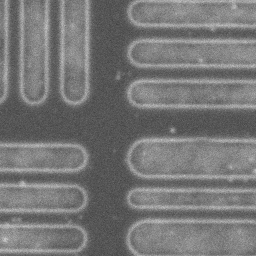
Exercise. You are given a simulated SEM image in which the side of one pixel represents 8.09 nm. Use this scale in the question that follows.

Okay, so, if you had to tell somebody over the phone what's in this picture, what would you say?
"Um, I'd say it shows groups of lines, slits or small figures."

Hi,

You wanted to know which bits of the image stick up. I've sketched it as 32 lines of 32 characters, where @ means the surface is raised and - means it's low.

-@@---@@---@@@@@@---------------
-@@---@@---@@@@@----------------
-@@---@@---@@@@@@---------------
-@@---@@---@@@@@@@@@@@@@@@@@@@@@
-@@---@@---@@@@@@@@@@@@@@@@@@@@@
-@@---@@---@@@@@@---------------
-@@---@@---@@@@@----------------
-@@---@@---@@@@@@---------------
-@@---@@---@@@@@@@@@@@@@@@@@@@@@
-@@---@@---@@@@@@@@@@@@@@@@@@@@@
-@@---@@---@@@@@@---------------
-@@---@@---@@@@@----------------
@@@--@@@@-@@@@@@----------------
@@@@@@@@@@@@@@@@@@@@@@@@@@@@@@@@
@@@@@@@@@@@@@@@@@@@@@@@@@@@@@@@@
@@@@@@@@@@@@@@@@@@@@@@@@@@@@@@@@
@@@@@@@@@@@@@@@@@@@@@@@@@@@@@@@@
@@@@@@@@@@@@@@@@@@@@@@@@@@@@@@@@
----------@@@@@@@---------------
-----------@@@@@----------------
----------@@@@@@----------------
@@@@@@@@@@@@@@@@@---------------
@@@@@@@@@@@@@@@@@@@@@@@@@@@@@@@@
----------@@@@@@@@@@@@@@@@@@@@@@
-----------@@@@@----------------
----------@@@@@@@---------------
@@@@@@@@@@@@@@@@@@@@@@@@@@@@@@@@
@@@@@@@@@@@@@@@@@@@@@@@@@@@@@@@@
----------@@@@@@@---------------
-----------@@@@@----------------
----------@@@@@@----------------
@@@@@@@@@@@@@@@@@---------------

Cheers